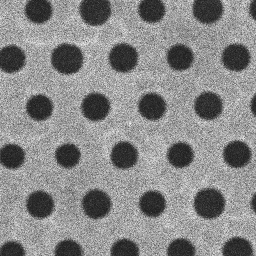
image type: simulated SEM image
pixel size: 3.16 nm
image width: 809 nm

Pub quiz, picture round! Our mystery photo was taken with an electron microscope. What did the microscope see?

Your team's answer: a regular array of holes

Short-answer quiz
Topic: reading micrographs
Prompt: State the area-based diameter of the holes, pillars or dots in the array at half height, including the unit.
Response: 0.0893 micrometres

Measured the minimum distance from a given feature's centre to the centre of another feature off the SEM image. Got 55.7 pixels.